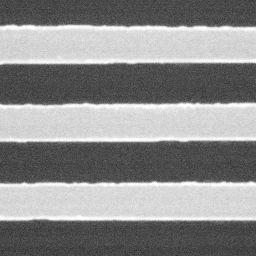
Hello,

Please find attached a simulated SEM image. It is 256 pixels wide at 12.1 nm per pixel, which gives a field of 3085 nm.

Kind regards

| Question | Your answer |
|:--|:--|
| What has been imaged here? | lines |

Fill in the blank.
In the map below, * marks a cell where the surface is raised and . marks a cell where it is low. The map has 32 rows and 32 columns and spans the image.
................................
................................
................................
*********************.****.**...
********************************
********************************
********************************
********************************
................................
................................
................................
................................
................................
********************************
********************************
********************************
********************************
********************..*.........
................................
................................
................................
................................
................................
********************************
********************************
********************************
********************************
................................
................................
................................
................................
................................